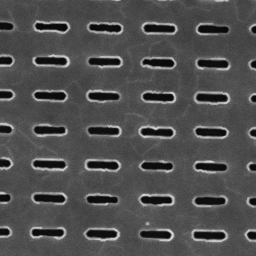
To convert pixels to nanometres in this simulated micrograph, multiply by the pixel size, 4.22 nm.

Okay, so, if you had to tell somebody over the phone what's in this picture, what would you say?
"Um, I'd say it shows a regular array of holes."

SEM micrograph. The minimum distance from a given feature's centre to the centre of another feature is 34.1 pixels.